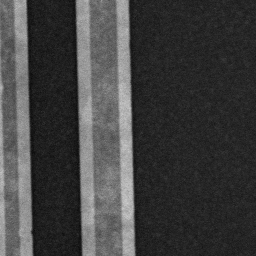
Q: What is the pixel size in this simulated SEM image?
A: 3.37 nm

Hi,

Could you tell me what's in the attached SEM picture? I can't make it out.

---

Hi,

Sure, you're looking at one or a few lines or trenches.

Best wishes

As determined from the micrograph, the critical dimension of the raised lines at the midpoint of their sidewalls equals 0.133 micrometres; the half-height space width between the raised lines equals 212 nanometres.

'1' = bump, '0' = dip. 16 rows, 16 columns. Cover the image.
1000011100000000
1000011100000000
1000011100000000
1000011100000000
1000011100000000
1000011100000000
1000011100000000
1000011100000000
1000011100000000
1100011100000000
1100011100000000
1100011100000000
1100011100000000
1100011100000000
1100011100000000
1100001100000000